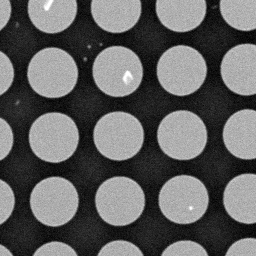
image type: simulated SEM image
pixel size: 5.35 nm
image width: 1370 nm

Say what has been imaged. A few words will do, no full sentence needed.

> an array of small figures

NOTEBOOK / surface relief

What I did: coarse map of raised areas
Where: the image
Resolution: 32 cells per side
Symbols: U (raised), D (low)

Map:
UDDDUUUUUUDUUUUUUUDDUUUUUUDDUUUU
UDDDUUUUUUDUUUUUUUDDUUUUUUDDUUUU
UDDDUUUUUDDDUUUUUDDDUUUUUDDDUUUU
DDDDDUUUDDDDDUUUDDDDDUUUDDDDDUUU
DDDDDDDDDDDDDDDDDDDDDDDDDDDDDDDD
DDDDDDDDDDDDDDDDDDDDDDDDDDDDDDDD
DDDDDUUUDDDDDUUUUDDDDUUUUDDDDUUU
UDDDUUUUUDDDUUUUUDDDUUUUUUDDUUUU
UUDDUUUUUUDDUUUUUUDDUUUUUUDDUUUU
UUDUUUUUUUDDUUUUUUDDUUUUUUDDUUUU
UDDDUUUUUDDDUUUUUDDDUUUUUDDDUUUU
UDDDDUUUUDDDDUUUUDDDDUUUDDDDDUUU
DDDDDDDDDDDDDDDDDDDDDDDDDDDDDDDD
DDDDDDDDDDDDDDDDDDDDDDDDDDDDDDDD
DDDDDUUUDDDDDUUUUDDDDUUUUDDDDUUU
UDDDUUUUUDDDUUUUUUDDUUUUUDDDUUUU
UDDDUUUUUUDDUUUUUUDDUUUUUUDDUUUU
UUDDUUUUUUDDUUUUUUDDUUUUUUDDUUUU
UDDDUUUUUDDDUUUUUUDDUUUUUDDDUUUU
UDDDDUUUUDDDDUUUUDDDDUUUUDDDDUUU
DDDDDDDDDDDDDDDDDDDDDDDDDDDDDDDD
DDDDDDDDDDDDDDDDDDDDDDDDDDDDDDDD
DDDDDDUUDDDDDDUUDDDDDUUUUDDDDUUU
UDDDUUUUUDDDUUUUUUDDUUUUUUDDUUUU
UUDDUUUUUUDDUUUUUUDDUUUUUUDDUUUU
UUDDUUUUUUDDUUUUUUDDUUUUUUDDUUUU
UDDDUUUUUDDDUUUUUUDDUUUUUUDDUUUU
UDDDDUUUUDDDDUUUUDDDDUUUUDDDDDUU
DDDDDDDDDDDDDDDDDDDDDDDDDDDDDDDD
DDDDDDDDDDDDDDDDDDDDDDDDDDDDDDDD
DDDDDDUUDDDDDUUUDDDDDDUUUDDDDUUU
UDDDUUUUUDDDUUUUUUDDUUUUUUDDUUUU